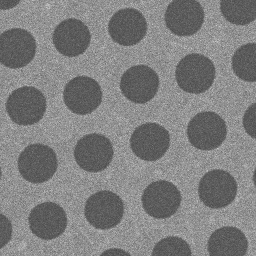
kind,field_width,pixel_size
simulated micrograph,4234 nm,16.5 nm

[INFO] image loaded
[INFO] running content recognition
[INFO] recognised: a regular array of holes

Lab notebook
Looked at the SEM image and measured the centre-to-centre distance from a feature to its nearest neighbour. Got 945 nanometres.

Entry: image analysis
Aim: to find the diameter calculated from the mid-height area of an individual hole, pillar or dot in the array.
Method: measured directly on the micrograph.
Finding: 656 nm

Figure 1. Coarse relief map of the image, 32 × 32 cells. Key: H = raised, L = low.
LLHHHHHHHHHHHHHHHHHHHLLLLHHLLLLL
HHHHHHHHHHHHHHHLLHHHHLLLLLHHLLLL
HHHHHHHHLLHHHHLLLLHHHLLLLLHHLLLL
HHHHHHHLLLLHHLLLLLHHHLLLLHHHHHHH
LLLLHHHLLLLHHHLLLLHHHHLHHHHHHHHH
LLLLLHHLLLLHHHHLLHHHHHHHHHHHHHHL
LLLLHHHLLLLHHHHHHHHHHHHHHHHHHLLL
LLLLHHHHHHHHHHHHHHHHHHHLLLHHHLLL
HLHHHHHHHHHHHHHHLLLHHHLLLLLHHLLL
HHHHHHHHHHLHHHHLLLLLHHLLLLLHHHLL
HHHHHHHHLLLLHHHLLLLLHHLLLLLHHHHH
HHLLLHHHLLLLLHHLLLLLHHHLLLHHHHHH
HLLLLLHHLLLLLHHHLLLHHHHHHHHHHHHH
HLLLLLHHLLLLHHHHHHHHHHHHHHHHHHHL
HLLLLHHHHHHHHHHHHHHHHHHHLLLLHHLL
HHLLHHHHHHHHHHHHHHLLHHHLLLLLHHLL
HHHHHHHHHHHHHHHHHLLLLHHLLLLLHHHL
HHHHHHHHHHLLLLHHLLLLLHHHLLLLHHHH
HHHLLLHHHLLLLLHHLLLLLHHHLLLHHHHH
HHLLLLLHHLLLLLHHHLLLHHHHHHHHHHHH
HHLLLLLHHHLLLLHHHHHHHHHHHHHHHHHH
HHLLLLLHHHHLHHHHHHHHHHHHHHLLHHHH
HHHLLLHHHHHHHHHHHHHHHHHHHLLLLHHH
HHHHHHHHHHHHHHHHHHLLLLHHHLLLLLHH
HHHHHHHHHHHLLLLHHHLLLLLHHLLLLHHH
HHHHHLLHHHHLLLLHHHLLLLLHHLLLLHHH
HHHHLLLLHHLLLLLHHHLLLLHHHHHHHHHH
LHHHLLLLHHHLLLLHHHHHHHHHHHHHHHHH
LLHHLLLLHHHHLLHHHHHHHHHHHHHLLLHH
LHHHHLLHHHHHHHHHHHHHHHHHHHLLLLLH
LHHHHHHHHHHHHHHHHHHHLLLHHHLLLLLH
HHHHHHHHHHHHHLLLHHHLLLLLHHLLLLLH